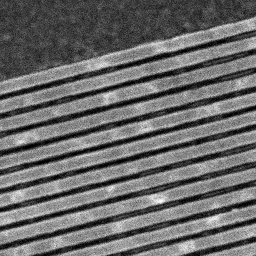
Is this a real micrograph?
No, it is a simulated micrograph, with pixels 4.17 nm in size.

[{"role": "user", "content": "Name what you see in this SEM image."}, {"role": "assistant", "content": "parallel lines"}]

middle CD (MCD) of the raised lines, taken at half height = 47.1 nanometres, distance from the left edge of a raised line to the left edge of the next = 75.9 nm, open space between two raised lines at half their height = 28.8 nm